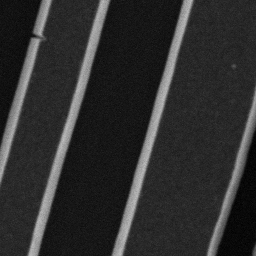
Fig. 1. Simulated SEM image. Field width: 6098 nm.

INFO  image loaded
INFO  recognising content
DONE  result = one or a few lines or trenches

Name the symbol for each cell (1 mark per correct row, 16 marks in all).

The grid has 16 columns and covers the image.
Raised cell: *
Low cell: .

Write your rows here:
...***......****
..****.....*****
..****.....*****
..****.....*****
..***.....******
.****.....******
.****.....******
.****.....******
****.....*******
****.....******.
****.....******.
***......******.
***.....******..
***.....******..
**......******..
**.....******...